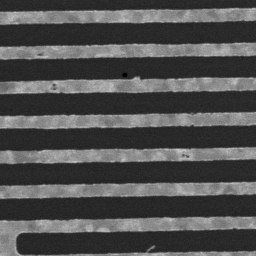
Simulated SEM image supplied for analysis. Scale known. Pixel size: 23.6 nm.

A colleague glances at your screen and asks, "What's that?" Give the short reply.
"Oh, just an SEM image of parallel lines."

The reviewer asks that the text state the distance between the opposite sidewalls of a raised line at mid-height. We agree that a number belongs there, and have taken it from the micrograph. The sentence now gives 284 nm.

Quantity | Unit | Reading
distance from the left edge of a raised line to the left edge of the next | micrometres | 0.821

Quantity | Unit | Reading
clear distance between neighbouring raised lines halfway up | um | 0.537